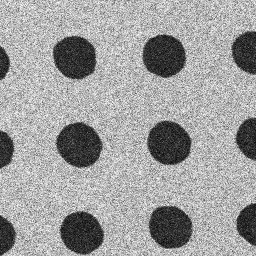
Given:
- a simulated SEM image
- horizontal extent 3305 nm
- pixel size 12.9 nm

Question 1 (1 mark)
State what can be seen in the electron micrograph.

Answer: holes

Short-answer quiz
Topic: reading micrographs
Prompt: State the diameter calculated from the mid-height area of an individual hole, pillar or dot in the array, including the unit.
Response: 563 nanometers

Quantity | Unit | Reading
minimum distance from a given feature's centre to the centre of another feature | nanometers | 1130